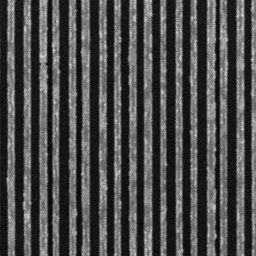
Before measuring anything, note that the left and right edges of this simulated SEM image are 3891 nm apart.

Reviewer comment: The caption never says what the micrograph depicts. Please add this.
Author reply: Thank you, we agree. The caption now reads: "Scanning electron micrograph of parallel lines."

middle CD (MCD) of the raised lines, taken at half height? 93.1 nanometres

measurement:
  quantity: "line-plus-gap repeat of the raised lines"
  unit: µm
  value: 0.232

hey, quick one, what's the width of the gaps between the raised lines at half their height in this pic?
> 0.144 µm